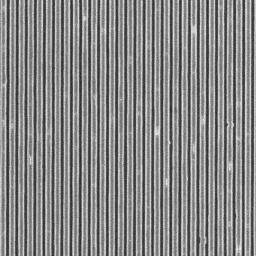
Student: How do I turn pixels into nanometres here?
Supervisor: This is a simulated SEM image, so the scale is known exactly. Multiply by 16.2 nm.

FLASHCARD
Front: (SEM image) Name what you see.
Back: parallel lines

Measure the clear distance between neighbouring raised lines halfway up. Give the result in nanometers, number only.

68.9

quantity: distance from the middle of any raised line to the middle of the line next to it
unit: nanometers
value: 147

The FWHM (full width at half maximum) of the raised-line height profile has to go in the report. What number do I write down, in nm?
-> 83